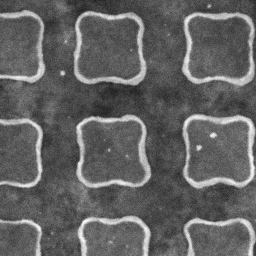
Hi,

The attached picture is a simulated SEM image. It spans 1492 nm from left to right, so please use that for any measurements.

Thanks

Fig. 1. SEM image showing raised bodies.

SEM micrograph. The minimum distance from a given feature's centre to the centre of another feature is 603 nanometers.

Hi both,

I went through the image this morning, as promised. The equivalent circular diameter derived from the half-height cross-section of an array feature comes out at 0.435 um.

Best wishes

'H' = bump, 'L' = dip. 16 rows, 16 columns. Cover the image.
LLLLLLLLLLLLLLLL
HHHLLHHHHLLLHHHH
HHHLLHHHHLLLHHHH
HHHLLHHHHLLLHHHH
HHHLLHHHHLLLHHHH
LLLLLLLLLLLLLLLL
LLLLLLLLLLLLLLLL
LLLLLHHHHLLLHHHL
HHHLLHHHHLLLHHHH
HHLLLHHHHLLLHHHH
HHHLLHHHHLLLHHHH
HHLLLHHHHLLLHLLL
LLLLLLLLLLLLLLLL
LLLLLLLLLLLLLLLL
HHHLLHHHHLLLHHHH
HHLLLHHHHLLLHHHH